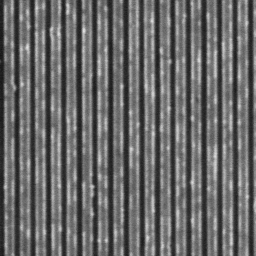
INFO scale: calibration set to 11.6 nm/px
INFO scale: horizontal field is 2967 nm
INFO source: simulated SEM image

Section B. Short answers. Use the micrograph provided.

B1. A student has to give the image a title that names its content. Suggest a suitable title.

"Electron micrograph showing parallel lines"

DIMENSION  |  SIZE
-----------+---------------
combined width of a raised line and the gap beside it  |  181 nm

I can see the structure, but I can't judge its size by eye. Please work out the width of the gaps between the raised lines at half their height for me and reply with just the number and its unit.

81.1 nm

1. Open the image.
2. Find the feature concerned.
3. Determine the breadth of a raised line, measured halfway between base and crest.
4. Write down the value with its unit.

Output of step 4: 104 nanometers